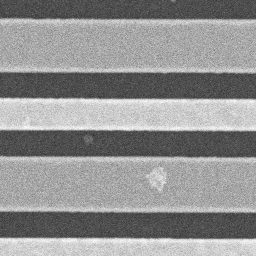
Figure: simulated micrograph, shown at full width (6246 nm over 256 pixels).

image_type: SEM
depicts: lines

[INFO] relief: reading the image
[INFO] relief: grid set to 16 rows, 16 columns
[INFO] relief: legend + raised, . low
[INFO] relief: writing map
................
++++++++++++++++
++++++++++++++++
++++++++++++++++
................
................
++++++++++++++++
++++++++++++++++
................
................
++++++++++++++++
++++++++++++++++
++++++++++++++++
................
................
++++++++++++++++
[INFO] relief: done